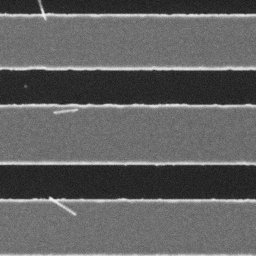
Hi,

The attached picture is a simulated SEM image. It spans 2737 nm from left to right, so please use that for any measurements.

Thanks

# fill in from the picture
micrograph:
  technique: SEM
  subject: lines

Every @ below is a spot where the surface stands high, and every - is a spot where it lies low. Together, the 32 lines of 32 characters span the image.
--------------------------------
--------------------------------
@@@@@@@@@@@@@@@@@@@@@@@@@@@@@@@@
@@@@@@@@@@@@@@@@@@@@@@@@@@@@@@@@
@@@@@@@@@@@@@@@@@@@@@@@@@@@@@@@@
@@@@@@@@@@@@@@@@@@@@@@@@@@@@@@@@
@@@@@@@@@@@@@@@@@@@@@@@@@@@@@@@@
@@@@@@@@@@@@@@@@@@@@@@@@@@@@@@@@
@@@@@@@@@@@@@@@@@@@@@@@@@@@@@@@@
--------------------------------
--------------------------------
--------------------------------
--------------------------------
@@@@@@@@@@@@@@@@@@@@@@@@@@@@@@@@
@@@@@@@@@@@@@@@@@@@@@@@@@@@@@@@@
@@@@@@@@@@@@@@@@@@@@@@@@@@@@@@@@
@@@@@@@@@@@@@@@@@@@@@@@@@@@@@@@@
@@@@@@@@@@@@@@@@@@@@@@@@@@@@@@@@
@@@@@@@@@@@@@@@@@@@@@@@@@@@@@@@@
@@@@@@@@@@@@@@@@@@@@@@@@@@@@@@@@
@@@@@@@@@@@@@@@@@@@@@@@@@@@@@@@@
--------------------------------
--------------------------------
--------------------------------
--------------------------------
@@@@@@@@@@@@@@@@@@@@@@@@@@@@@@@@
@@@@@@@@@@@@@@@@@@@@@@@@@@@@@@@@
@@@@@@@@@@@@@@@@@@@@@@@@@@@@@@@@
@@@@@@@@@@@@@@@@@@@@@@@@@@@@@@@@
@@@@@@@@@@@@@@@@@@@@@@@@@@@@@@@@
@@@@@@@@@@@@@@@@@@@@@@@@@@@@@@@@
@@@@@@@@@@@@@@@@@@@@@@@@@@@@@@@@